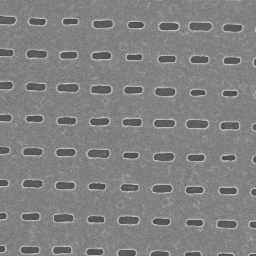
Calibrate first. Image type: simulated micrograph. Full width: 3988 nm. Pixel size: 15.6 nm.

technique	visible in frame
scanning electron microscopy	a regular array of holes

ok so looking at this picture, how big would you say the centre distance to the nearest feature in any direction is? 499 nm